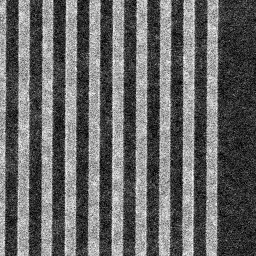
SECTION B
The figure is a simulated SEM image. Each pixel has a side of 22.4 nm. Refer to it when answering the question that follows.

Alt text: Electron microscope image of parallel lines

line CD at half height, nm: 224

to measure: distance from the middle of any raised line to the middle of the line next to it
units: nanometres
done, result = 528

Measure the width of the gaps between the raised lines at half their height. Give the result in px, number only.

13.9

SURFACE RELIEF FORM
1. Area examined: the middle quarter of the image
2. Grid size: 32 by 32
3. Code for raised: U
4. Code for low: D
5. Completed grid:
DUUDDDUUUDDDUUUDDDUUUDDDUUDDDDUU
DUUDDDUUUDDDUUUDDDUUUDDDUUDDDDUU
DUUDDDUUUDDDUUUDDDUUDDDDUUDDDDUU
DUUDDDUUUDDDUUUDDDUUDDDDUUDDDDUU
DUUDDDUUUDDDUUUDDDUUDDDDUUDDDDUU
DUUDDDUUUDDDUUUDDDUUDDDDUUDDDDUU
DUUDDDUUUDDDUUUDDDUUDDDDUUDDDDUU
DUUDDDUUUDDDUUUDDDUUDDDDUUDDDDUU
DUUDDDUUUDDDUUUDDDUUDDDDUDDDDDUU
DUUDDDUUUDDDUUUDDDUUDDDDUUDDDDUU
DUUDDDUUUDDDUUUDDDUUDDDDUUDDDDUU
DUUDDDUUUDDDUUUDDDUUDDDDUUDDDDUU
DUUDDDUUUDDDUUUDDDUUDDDDUUDDDDUU
DUUDDDUUUDDDUUUDDDUUDDDDUUDDDDUU
DUUDDDUUUDDDUUUDDDUUDDDDUUDDDDUU
DUUDDDUUUDDDUUUDDDUUDDDDUUDDDDUU
DUUDDDUUUDDDUUUDDDUUDDDDUUDDDDUU
DUUDDDUUUDDDUUUDDDUUDDDDUUDDDDUU
DUUDDDUUUDDDUUUDDDUUDDDDUUDDDDUU
DUUDDDUUUDDDUUUDDDUUDDDDUUDDDDUU
DUUDDDUUUDDDUUUDDDUUDDDDUUDDDDUU
DUUDDDUUUDDDUUUDDDUUDDDDUUDDDDUU
DUUDDDUUUDDDUUUDDDUUDDDDUUDDDDUU
DUUDDDUUUDDDUUUDDDUUDDDDUUDDDDUU
DUUDDDUUUDDDUUUDDDUUDDDDUUDDDDUU
DUUDDDUUUDDDUUUDDDUUDDDDUUDDDDUU
DUUDDDUUUDDDUUUDDDUUDDDDUUDDDDUU
DUUDDDUUUDDDUUUDDDUUDDDDUUDDDDUU
DUUDDDUUUDDDUUUDDDUUDDDDUUDDDDUU
DUUDDDUUUDDDUUUDDDUUDDDDUUDDDDUU
DUUDDDUUUDDDUUUDDDUUDDDDUUDDDDUU
DUUDDDUUUDDDUUUDDDUUDDDDUUDDDDUU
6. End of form